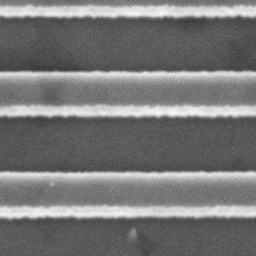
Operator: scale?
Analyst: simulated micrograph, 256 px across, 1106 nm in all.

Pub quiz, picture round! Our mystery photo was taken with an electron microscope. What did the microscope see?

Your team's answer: lines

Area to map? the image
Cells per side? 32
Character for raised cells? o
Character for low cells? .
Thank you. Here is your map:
oooooooooooooooooooooooooooooooo
oooooooooooooooooooooooooooooooo
................................
................................
................................
................................
................................
................................
................................
oooooooooooooooooooooooooooooooo
oooooooooooooooooooooooooooooooo
oooooooooooooooooooooooooooooooo
oooooooooooooooooooooooooooooooo
oooooooooooooooooooooooooooooooo
................................
................................
................................
................................
................................
................................
................................
................................
oooooooooooooooooooooooooooooooo
oooooooooooooooooooooooooooooooo
oooooooooooooooooooooooooooooooo
oooooooooooooooooooooooooooooooo
oooooooooooooooooooooooooooooooo
................................
................................
................................
................................
................................